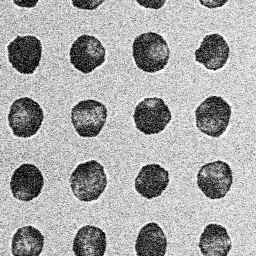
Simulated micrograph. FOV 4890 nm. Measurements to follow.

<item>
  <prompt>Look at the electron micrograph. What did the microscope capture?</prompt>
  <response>a regular array of holes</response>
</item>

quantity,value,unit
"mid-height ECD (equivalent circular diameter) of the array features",722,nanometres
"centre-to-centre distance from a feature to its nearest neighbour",1190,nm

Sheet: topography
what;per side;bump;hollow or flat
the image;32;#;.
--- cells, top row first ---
##...####....####....####...####
################################
################################
################################
##..######..#####...######..####
#....####....####....####....###
#....####....####....###.....###
#....####....####....###....####
##...####...#####....#####..####
################################
################################
################################
##..######..######..######..####
#....####....####....####....###
#....####....####....###.....###
#....####....####....####....###
##...#####...#####..#####...####
################################
################################
################################
###.######...######.######..####
##...####....####....####....###
#....####....####....####....###
#....####....####....####....###
##...####....#####..######..####
################################
################################
################################
##..######..######..######..####
##...####....####....####....###
#....####....####....####....###
#....####....####....####....###